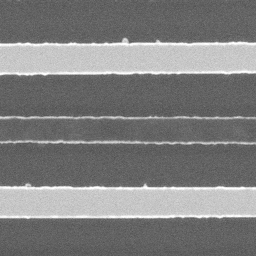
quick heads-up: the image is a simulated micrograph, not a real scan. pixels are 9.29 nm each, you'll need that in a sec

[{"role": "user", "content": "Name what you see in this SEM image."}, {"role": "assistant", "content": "lines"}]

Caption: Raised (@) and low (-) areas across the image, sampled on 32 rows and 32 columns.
--------------------------------
--------------------------------
--------------------------------
--------------------------------
--------------------------------
--@@-@@@@@-@-@@@@@@@@@@@@@@@@@@@
@@@@@@@@@@@@@@@@@@@@@@@@@@@@@@@@
@@@@@@@@@@@@@@@@@@@@@@@@@@@@@@@@
@@@@@@@@@@@@@@@@@@@@@@@@@@@@@@@@
--------------------------------
--------------------------------
--------------------------------
--------------------------------
--------------------------------
--------------------------------
@@@@@@@@@@@@@@@@@@@@@@@@@@@@@@@@
@@@@@@@@@@@@@@@@@@@@@@@@@@@@@@@@
@@@@@@@@@@@@@@@@@@@@@@@@@@@@@@@@
--------------------------------
--------------------------------
--------------------------------
--------------------------------
--------------------------------
@@@@@@@@@@@@@@@@@@@@@@@@@@@@@@@@
@@@@@@@@@@@@@@@@@@@@@@@@@@@@@@@@
@@@@@@@@@@@@@@@@@@@@@@@@@@@@@@@@
@@@@@@@@@@@@@@@@@@@@@@@@@@@@@@@@
--------------------------------
--------------------------------
--------------------------------
--------------------------------
--------------------------------